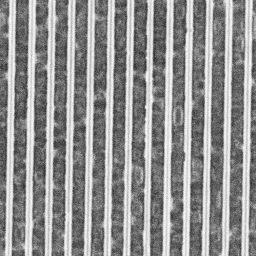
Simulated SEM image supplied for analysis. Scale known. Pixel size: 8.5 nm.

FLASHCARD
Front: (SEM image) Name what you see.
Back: parallel lines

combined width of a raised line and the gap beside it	168	nm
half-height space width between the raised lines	126	nm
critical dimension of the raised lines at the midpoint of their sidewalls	39.3	nanometres